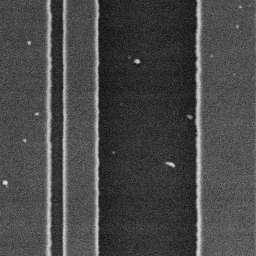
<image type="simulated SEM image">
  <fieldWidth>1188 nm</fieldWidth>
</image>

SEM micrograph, lines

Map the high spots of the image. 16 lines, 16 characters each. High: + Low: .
++++++......++++
++++++......++++
++++++......++++
++++++......++++
++++++......++++
++++++......++++
++++++......++++
++++++......++++
++++++......++++
++++++......++++
++++++......++++
++++++......++++
++++++......++++
++++++......++++
++++++......++++
++++++......++++